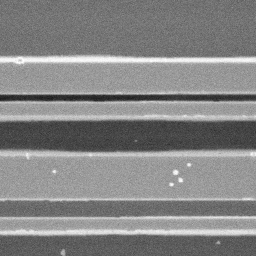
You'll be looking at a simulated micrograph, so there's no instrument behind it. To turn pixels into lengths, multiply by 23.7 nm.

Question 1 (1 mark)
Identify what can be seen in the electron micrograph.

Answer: lines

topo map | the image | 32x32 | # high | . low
................................
................................
................................
................................
................................
................................
................................
..#.............................
################################
################################
################################
################################
################################
################################
################################
................................
................................
................................
................................
################################
################################
################################
################################
################################
################################
################################
################################
################################
################################
................................
................................
................................